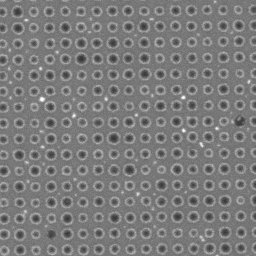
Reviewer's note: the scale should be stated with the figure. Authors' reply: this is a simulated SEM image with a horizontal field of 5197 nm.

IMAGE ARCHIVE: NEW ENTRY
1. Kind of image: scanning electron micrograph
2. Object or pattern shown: a regular array of raised bodies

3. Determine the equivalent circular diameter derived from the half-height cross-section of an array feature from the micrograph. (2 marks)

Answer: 0.202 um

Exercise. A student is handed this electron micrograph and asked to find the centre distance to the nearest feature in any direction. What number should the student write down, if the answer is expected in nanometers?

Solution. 315